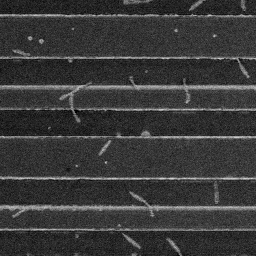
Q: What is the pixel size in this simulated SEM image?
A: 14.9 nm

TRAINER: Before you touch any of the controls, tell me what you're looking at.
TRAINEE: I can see lines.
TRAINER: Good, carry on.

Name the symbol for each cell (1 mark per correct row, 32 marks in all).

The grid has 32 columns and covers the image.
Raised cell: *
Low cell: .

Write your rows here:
................................
................................
********************************
********************************
********************************
********************************
********************************
................................
................................
................................
................................
********************************
********************************
********************************
................................
................................
................................
********************************
********************************
********************************
********************************
********************************
................................
................................
................................
................................
********************************
********************************
********************************
................................
................................
................................